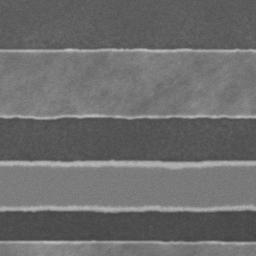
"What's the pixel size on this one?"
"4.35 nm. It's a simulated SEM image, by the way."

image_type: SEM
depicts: lines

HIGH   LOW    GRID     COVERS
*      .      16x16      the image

................
................
................
****************
****************
****************
****************
................
................
................
****************
****************
****************
................
................
****************